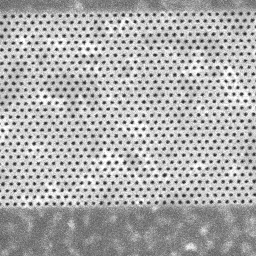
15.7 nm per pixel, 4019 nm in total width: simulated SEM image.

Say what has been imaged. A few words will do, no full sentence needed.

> a regular array of holes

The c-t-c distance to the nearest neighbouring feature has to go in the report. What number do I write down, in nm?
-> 117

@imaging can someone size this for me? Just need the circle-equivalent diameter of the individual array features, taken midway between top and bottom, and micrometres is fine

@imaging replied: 0.0663